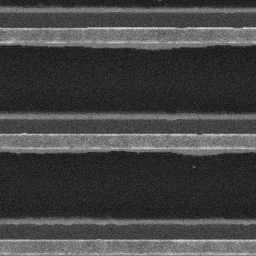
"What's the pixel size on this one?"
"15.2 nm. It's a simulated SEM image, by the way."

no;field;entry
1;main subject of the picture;lines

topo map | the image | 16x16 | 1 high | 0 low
0000000000000000
1111111111111111
1111111111111111
0000000000000000
0000000000000000
0000000000000000
0000000000000000
1111111111111111
1111111111111111
0000000000000000
0000000000000000
0000000000000000
0000000000000000
0000000000000000
1111111111111111
1111111111111111